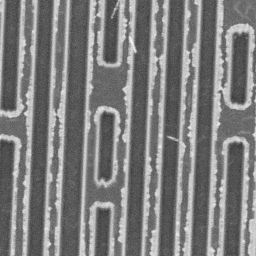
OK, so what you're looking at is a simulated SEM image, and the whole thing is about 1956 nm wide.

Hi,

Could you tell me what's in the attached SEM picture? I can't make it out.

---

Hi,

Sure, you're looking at parallel lines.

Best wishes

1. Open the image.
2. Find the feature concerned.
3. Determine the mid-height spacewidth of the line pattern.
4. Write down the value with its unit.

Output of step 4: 148 nanometers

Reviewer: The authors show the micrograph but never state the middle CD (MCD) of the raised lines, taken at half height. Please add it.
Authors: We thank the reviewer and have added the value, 100 nm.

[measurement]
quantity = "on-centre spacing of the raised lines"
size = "250 nm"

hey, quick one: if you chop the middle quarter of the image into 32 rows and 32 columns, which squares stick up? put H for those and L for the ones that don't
LLLLLLHHHHHHHHHHHLLLLLHHHLLLLLHH
LLLLLLHHHHHHHHHHHLLLLLHHHLLLLLHH
LLLLLLHHHHHHHHHHHLLLLLHHHLLLLLHH
LLLLLLHHHHHHHHHHHLLLLLHHHLLLLLHH
LLLLLLHHHHHHHHHHHLLLLLHHHLLLLLHH
LLLLLLHHHHHHHHHHHLLLLLHHHLLLLLHH
LLLLLLHHHHHHHHHHLLLLLLHHHLLLLLHH
LLLLLLHHHHHHHHHHLLLLLLHHHLLLLLHH
LLLLLLHHHHHHHHHHLLLLLLHHHLLLLLHH
LLLLLLHHHHHHHHHHLLLLLLHHLLLLLLHH
LLLLLLHHHHHHHHHHLLLLLLHHLLLLLLHH
LLLLLLHHHHLHHHHHLLLLLLHHLLLLLLHH
LLLLLLHHHLLLLHHHLLLLLHHHLLLLLLHH
LLLLLLHHHLLLLHHHLLLLLHHHLLLLLLHH
LLLLLLHHLLLLLHHHLLLLLHHHLLLLLLHH
LLLLLLHHLLLLLHHHLLLLLHHHLLLLLHHH
LLLLLLHHLLLLLHHHLLLLLHHHLLLLLHHH
LLLLLLHHLLLLLHHHLLLLLHHHLLLLLHHH
LLLLLLHHLLLLLHHHLLLLLHHHLLLLLHHH
LLLLLLHHLLLLLHHHLLLLLHHHLLLLLHHH
LLLLLLHHLLLLLHHHLLLLLHHHLLLLLHHH
LLLLLLHHLLLLLHHHLLLLLHHHLLLLLHHH
LLLLLHHHLLLLLHHHLLLLLHHHLLLLLHHH
LLLLLHHHLLLLLHHHLLLLLHHHLLLLLHHH
LLLLLHHHLLLLLHHHLLLLLHHHLLLLLHHH
LLLLLHHHLLLLLHHHLLLLLHHHLLLLLHHH
LLLLLHHHLLLLLHHHLLLLLHHHLLLLLHHH
LLLLLHHHLLLLLHHHLLLLLHHHLLLLLHHH
LLLLLHHHLLLLLHHHLLLLLHHHLLLLLHHH
LLLLLHHHLHLLHHHHLLLLLHHHLLLLLHHH
LLLLLHHHHHHHHHHLLLLLLHHHLLLLLHHH
LLLLLHHHHHHHHHHLLLLLLHHHLLLLLHHH